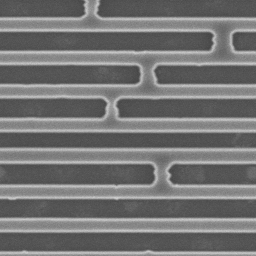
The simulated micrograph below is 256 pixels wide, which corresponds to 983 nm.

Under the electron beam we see parallel lines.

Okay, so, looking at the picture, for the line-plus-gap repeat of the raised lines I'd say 33.4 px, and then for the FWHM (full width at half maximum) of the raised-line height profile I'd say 47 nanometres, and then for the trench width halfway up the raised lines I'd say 79.7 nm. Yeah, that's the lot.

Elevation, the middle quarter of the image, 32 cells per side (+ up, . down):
...................++++.........
...................+++..........
...................+++..........
...................++++.........
...................++++.........
++++++++++++++++++++++++++++++++
++++++++++++++++++++++++++++++++
++++++++++++++++++++++++++++++++
..........++++..................
...........++...................
...........++...................
...........++...................
...........++...................
..........++++..................
++++++++++++++++++++++++++++++++
++++++++++++++++++++++++++++++++
++++++++++++++++++++++++++++++++
................................
................................
................................
................................
++++++++++++++++++++++++++++++++
++++++++++++++++++++++++++++++++
++++++++++++++++++++++++++++++++
++++++++++++++++++++++++++++++++
.......................++++.....
.......................+++......
.......................+++......
.......................+++......
.......................+++......
.....................++++++++...
++++++++++++++++++++++++++++++++